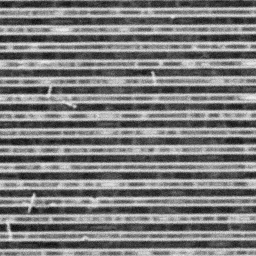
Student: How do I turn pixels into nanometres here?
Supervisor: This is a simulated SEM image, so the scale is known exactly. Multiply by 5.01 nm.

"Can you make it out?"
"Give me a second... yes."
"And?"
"parallel lines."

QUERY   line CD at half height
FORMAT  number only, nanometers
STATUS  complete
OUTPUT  39.4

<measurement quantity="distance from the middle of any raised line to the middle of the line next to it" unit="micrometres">0.0861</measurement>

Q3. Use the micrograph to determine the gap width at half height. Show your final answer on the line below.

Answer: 48.8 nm